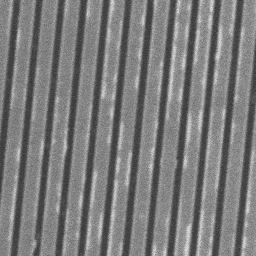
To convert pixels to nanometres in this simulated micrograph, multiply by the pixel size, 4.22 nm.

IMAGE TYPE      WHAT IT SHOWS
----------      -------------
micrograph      parallel lines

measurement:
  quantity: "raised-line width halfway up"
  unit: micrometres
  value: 0.0608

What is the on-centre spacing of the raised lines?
93.7 nm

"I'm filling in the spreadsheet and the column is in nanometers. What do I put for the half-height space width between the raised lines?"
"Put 32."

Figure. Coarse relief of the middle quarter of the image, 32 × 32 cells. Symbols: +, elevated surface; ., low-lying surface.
++..++++..+++...+++..++++..+++..
++..++++..+++...+++..++++..+++..
++..++++..+++..++++..+++...+++..
++..++++..+++..++++..+++..++++..
++..+++...+++..++++..+++..++++..
++..+++..++++..++++..+++..++++..
++..+++..++++..++++..+++..++++..
++..+++..++++..+++..++++..+++...
++..+++..++++..+++..++++..+++..+
+...+++..+++...+++..++++..+++...
+..++++..+++...+++..++++..+++..+
+..++++..+++...+++..++++..+++..+
+..++++..+++..++++..+++...+++..+
+..++++..+++..++++..+++..++++..+
+..+++...+++..++++..+++..++++..+
+..+++..++++..++++..+++..++++..+
+..+++..++++..++++..+++..++++..+
+..+++..++++..+++...+++..+++...+
+..+++..++++..+++..++++..+++...+
+..+++..+++...+++..++++..+++...+
+.++++..+++...+++..++++..+++..++
+.++++..+++...+++..++++..+++..++
..++++..+++..++++..+++...+++..++
..++++..+++..++++..+++..++++..++
..+++...+++..++++..+++..++++..++
..+++..++++..++++..+++..++++..++
..+++..++++..++++..+++..++++..++
..+++..++++..+++...+++..+++...++
..+++..++++..+++..++++..+++...++
..+++..+++...+++..++++..+++...++
.++++..+++...+++..++++..+++..+++
.++++..+++...+++..++++..+++..+++